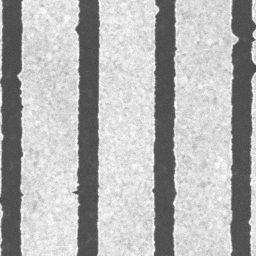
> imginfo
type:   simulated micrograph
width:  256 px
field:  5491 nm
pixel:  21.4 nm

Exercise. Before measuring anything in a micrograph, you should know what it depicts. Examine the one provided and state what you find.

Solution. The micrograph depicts one or a few lines or trenches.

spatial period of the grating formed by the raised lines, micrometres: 1.65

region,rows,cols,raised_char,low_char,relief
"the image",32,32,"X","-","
---XXXXXXX--XXXXXXX---XXXXXXX---
---XXXXXXX--XXXXXXXX--XXXXXXX---
---XXXXXXX---XXXXXX---XXXXXXX---
---XXXXXX----XXXXXX---XXXXXXX---
---XXXXXXX--XXXXXXX---XXXXXXX---
---XXXXXXX---XXXXXX---XXXXXXX---
---XXXXXXX---XXXXXX---XXXXXXX---
---XXXXXXX--XXXXXXX---XXXXXXX---
---XXXXXXX--XXXXXXX---XXXXXXX---
--XXXXXXXX---XXXXXX---XXXXXXX---
---XXXXXXX--XXXXXXX---XXXXXXX---
---XXXXXXX--XXXXXXX---XXXXXXX---
---XXXXXXX--XXXXXXX---XXXXXXX---
---XXXXXXX--XXXXXXX---XXXXXXX---
---XXXXXXX--XXXXXXX---XXXXXXX---
---XXXXXXX--XXXXXXX---XXXXXXX---
---XXXXXXX--XXXXXXX---XXXXXXX---
---XXXXXXX--XXXXXXX---XXXXXXX---
---XXXXXXX--XXXXXXX---XXXXXXX---
---XXXXXXX--XXXXXXX---XXXXXXX--X
---XXXXXXX---XXXXXX---XXXXXXX---
---XXXXXXX--XXXXXXX---XXXXXXX--X
---XXXXXXX--XXXXXXX---XXXXXXX--X
---XXXXXXX--XXXXXXX---XXXXXXX--X
---XXXXXX---XXXXXXX---XXXXXXX--X
---XXXXXXX--XXXXXXX---XXXXXXX--X
---XXXXXXX--XXXXXXX---XXXXXXX--X
---XXXXXXX--XXXXXXX---XXXXXXX--X
---XXXXXXX--XXXXXXX---XXXXXXX--X
---XXXXXXX--XXXXXXX---XXXXXXX--X
---XXXXXXX--XXXXXXX---XXXXXXX--X
---XXXXXXX--XXXXXXX---XXXXXXX--X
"